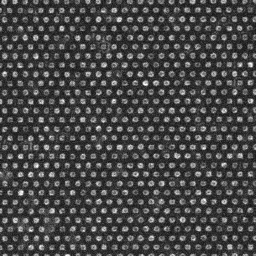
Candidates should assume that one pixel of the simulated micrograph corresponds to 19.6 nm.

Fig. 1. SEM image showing a regular array of raised bodies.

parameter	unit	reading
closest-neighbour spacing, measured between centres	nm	199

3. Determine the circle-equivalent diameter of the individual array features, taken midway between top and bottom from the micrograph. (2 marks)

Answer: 96.6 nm